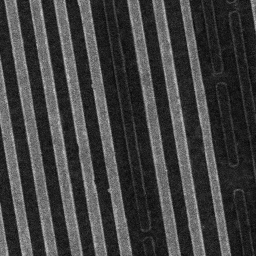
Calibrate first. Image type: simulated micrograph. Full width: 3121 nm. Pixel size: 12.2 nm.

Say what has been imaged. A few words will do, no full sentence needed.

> parallel lines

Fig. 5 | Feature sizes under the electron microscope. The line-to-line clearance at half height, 14.7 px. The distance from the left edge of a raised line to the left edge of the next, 296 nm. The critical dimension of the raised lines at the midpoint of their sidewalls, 123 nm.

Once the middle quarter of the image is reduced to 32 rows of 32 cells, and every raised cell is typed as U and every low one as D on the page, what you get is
UUUDDDUUUDDDDUUDDDDUUDDDDUUDDDDD
UUUDDDDUUDDDDUUDDDDUUDDDDUUUDDDD
DUUDDDDUUDDDDUUDDDDUUUDDDUUUDDDD
DUUDDDDUUDDDDUUUDDDUUUDDDUUUDDDD
DUUDDDDUUUDDDUUUDDDDUUDDDDUUDDDD
DUUUDDDUUUDDDUUUDDDDUUDDDDUUDDDD
DDUUDDDUUUDDDDUUDDDDUUDDDDUUDDDD
DDUUDDDDUUDDDDUUDDDDUUDDDDUUUDDD
DDUUDDDDUUDDDDUUDDDDUUDDDDUUUDDD
DDUUDDDDUUUDDDUUUDDDUUUDDDUUUDDD
DDUUDDDDUUUDDDUUUDDDDUUDDDDUUDDD
DDUUUDDDUUUDDDUUUDDDDUUDDDDUUDDD
DDUUUDDDDUUDDDDUUDDDDUUDDDDUUDDD
DDUUUDDDDUUDDDDUUDDDDUUDDDDUUUDD
DDDUUDDDDUUDDDDUUDDDDUUDDDDUUUDD
DDDUUDDDDUUDDDDUUUDDDUUUDDDUUUDD
DDDUUDDDDUUDDDDUUUDDDDUUDDDDUUDD
DDDUUUDDDUUUDDDUUUDDDDUUDDDDUUDD
DDDUUUDDDUUUDDDDUUDDDDUUDDDDUUDD
DDDUUUDDDDUUDDDDUUDDDDUUDDDDUUDD
DDDDUUDDDDUUDDDDUUDDDDUUDDDDUUDD
DDDDUUDDDDUUDDDDUUUDDDUUUDDDUUUD
DDDDUUDDDDUUUDDDUUUDDDUUUDDDDUUD
DDDDUUUDDDUUUDDDUUUDDDUUUDDDDUUD
UDDDUUUDDDUUUDDDDUUDDDDUUDDDDUUD
UDDDUUUDDDDUUDDDDUUDDDDUUDDDDUUD
UDDDDUUDDDDUUDDDDUUDDDDUUUDDDUUD
UDDDDUUDDDDUUDDDDUUUDDDUUUDDDUUU
UDDDDUUDDDDUUDDDDUUUDDDUUUDDDDUU
UDDDDUUDDDDUUUDDDUUUDDDUUUDDDDUU
UDDDDUUUDDDDUUDDDDUUDDDDUUDDDDUU
UUDDDUUUDDDUUUDDDDUUDDDDUUDDDDUU